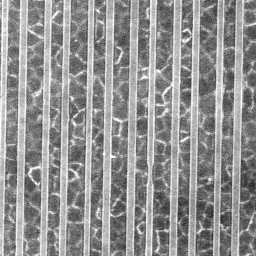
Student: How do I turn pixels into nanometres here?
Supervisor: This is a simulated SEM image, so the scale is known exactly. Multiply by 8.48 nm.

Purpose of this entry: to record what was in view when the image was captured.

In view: parallel lines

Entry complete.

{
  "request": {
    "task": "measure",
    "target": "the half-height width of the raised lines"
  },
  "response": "53 nm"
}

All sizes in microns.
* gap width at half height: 0.111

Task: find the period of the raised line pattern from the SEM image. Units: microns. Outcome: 0.182